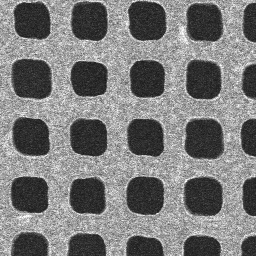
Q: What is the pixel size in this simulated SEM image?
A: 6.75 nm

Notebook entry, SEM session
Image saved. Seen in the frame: a regular array of holes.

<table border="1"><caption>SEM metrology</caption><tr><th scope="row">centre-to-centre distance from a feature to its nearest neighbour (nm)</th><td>386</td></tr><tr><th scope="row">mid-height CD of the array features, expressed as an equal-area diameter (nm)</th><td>265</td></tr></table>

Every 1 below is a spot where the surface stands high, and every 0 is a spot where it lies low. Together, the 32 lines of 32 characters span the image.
11000111110001111000111100111110
11000011100001110000011000001100
11000011100001110000011000001100
11000011100001110000011000001100
11100011100001111000111100001110
11111111111111111111111111111111
11111111111111111111111111111111
11000111111111111101111111111111
10000011100001110000111000011110
10000011100001110000011000001100
11000011100001110000011000001100
11000011100001111000111000011100
11111111111111111111111111111111
11111111111111111111111111111111
11111111111111111111111111111111
11000011100001110000111000011100
11000011100001110000111000001100
11000011100001110000111000001100
11000011100001110000111000001100
11110111111011111110111100011111
11111111111111111111111111111111
11111111111111111111111111111111
11000011110011110000111100011110
10000011100001110000011000001100
10000011100001110000111000001100
11000011100001110000111000001100
11100111110001111000111100011110
11111111111111111111111111111111
11111111111111111111111111111111
11000111100001111111111100111111
11000011100001110000111000001100
10000011100001110000111000001100